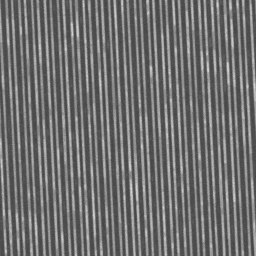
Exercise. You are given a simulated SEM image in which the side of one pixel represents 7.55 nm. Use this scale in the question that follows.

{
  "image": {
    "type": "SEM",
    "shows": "parallel lines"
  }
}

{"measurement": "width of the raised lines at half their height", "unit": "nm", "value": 15.1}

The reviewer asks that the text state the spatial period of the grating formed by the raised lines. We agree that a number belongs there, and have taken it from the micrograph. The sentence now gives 48.4 nm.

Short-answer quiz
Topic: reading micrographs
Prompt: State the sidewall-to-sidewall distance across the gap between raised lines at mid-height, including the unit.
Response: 34.9 nm